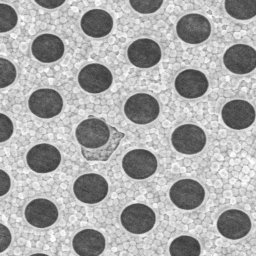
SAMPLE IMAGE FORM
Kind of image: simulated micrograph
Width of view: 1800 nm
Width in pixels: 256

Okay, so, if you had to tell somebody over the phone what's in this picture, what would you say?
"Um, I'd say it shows a regular array of holes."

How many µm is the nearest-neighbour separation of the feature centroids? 0.387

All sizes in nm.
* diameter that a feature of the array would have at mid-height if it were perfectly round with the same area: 230